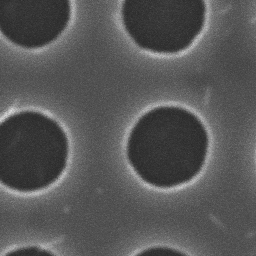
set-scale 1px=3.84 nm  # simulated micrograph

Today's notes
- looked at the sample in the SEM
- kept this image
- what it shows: holes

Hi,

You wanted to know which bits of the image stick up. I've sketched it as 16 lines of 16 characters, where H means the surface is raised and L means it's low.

LLLLHHHHLLLLLHHH
LLLLHHHHLLLLLHHH
HLLHHHHHLLLLHHHH
HHHHHHHHHHHHHHHH
HHHHHHHHHHHHHHHH
HHHHHHHHHHHHHHHH
HHHHHHHHHHHHHHHH
LLLHHHHHHLLLHHHH
LLLLHHHHLLLLLHHH
LLLLHHHHLLLLLHHH
LLLLHHHHLLLLLHHH
LLLHHHHHHLLHHHHH
HHHHHHHHHHHHHHHH
HHHHHHHHHHHHHHHH
HHHHHHHHHHHHHHHH
HLLHHHHHHLLHHHHH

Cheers